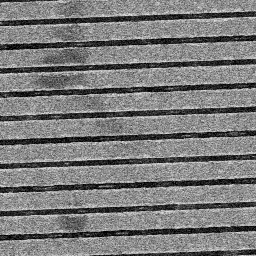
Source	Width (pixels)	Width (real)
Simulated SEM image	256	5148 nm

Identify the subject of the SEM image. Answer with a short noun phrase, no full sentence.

parallel lines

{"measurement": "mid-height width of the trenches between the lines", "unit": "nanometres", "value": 123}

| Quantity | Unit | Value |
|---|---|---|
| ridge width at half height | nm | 348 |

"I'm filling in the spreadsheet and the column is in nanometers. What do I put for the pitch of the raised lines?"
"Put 478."